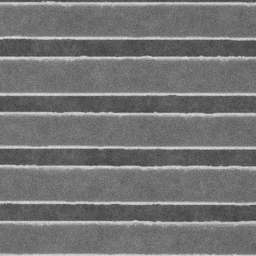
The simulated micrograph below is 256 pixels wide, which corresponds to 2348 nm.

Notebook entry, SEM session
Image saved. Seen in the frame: lines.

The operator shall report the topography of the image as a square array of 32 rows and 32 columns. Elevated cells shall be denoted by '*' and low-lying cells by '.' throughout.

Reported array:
********************************
********************************
********************************
********************************
********************************
................................
................................
********************************
********************************
********************************
********************************
********************************
................................
................................
********************************
********************************
********************************
********************************
................................
................................
................................
********************************
********************************
********************************
********************************
...........................*****
................................
................................
********************************
********************************
********************************
********************************